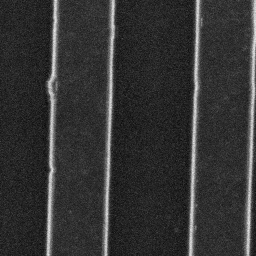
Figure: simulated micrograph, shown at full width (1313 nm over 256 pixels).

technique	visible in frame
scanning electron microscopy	one or a few lines or trenches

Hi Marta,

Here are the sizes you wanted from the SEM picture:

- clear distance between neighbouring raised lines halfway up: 430 nm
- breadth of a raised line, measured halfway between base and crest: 299 nm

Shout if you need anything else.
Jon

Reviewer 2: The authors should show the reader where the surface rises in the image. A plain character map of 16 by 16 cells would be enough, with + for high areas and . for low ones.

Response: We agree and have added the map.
...++++.....++++
...++++.....++++
...++++.....++++
...++++.....++++
...++++.....++++
...++++.....++++
...++++.....++++
...++++.....++++
...++++.....++++
...++++.....++++
...++++.....++++
...++++.....++++
...++++.....++++
...++++.....++++
...++++.....++++
...++++.....++++